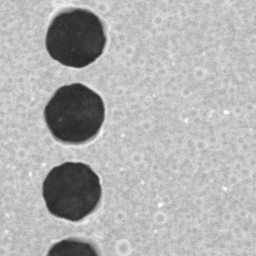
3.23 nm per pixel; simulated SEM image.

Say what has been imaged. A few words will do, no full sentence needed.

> holes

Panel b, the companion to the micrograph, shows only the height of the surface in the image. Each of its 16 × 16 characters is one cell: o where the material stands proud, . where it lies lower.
oooooooooooooooo
ooo...oooooooooo
ooo....ooooooooo
ooo...oooooooooo
oooooooooooooooo
oooo..oooooooooo
ooo...oooooooooo
ooo...oooooooooo
ooo...oooooooooo
oooooooooooooooo
ooo...oooooooooo
ooo...oooooooooo
ooo...oooooooooo
ooo..ooooooooooo
oooooooooooooooo
ooo...oooooooooo